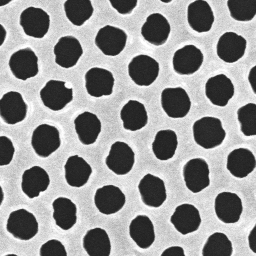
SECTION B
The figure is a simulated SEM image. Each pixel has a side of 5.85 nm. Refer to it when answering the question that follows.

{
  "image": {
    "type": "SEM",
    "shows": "a regular array of holes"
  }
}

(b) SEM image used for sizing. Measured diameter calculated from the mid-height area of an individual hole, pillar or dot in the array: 177 nm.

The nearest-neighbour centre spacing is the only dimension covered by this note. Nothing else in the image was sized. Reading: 254 nm